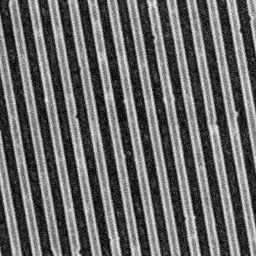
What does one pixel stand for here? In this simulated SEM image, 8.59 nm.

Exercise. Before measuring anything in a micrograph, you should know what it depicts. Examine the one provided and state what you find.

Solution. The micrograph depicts parallel lines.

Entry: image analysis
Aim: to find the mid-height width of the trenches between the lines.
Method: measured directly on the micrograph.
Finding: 102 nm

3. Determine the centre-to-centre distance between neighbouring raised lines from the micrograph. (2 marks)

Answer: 168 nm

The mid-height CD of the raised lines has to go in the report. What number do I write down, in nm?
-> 67.7